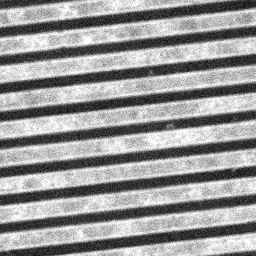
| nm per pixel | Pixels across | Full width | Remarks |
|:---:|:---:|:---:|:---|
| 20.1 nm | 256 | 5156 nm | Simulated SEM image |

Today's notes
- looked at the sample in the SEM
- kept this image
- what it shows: parallel lines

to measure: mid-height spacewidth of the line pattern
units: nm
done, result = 250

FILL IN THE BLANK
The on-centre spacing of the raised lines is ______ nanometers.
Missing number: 560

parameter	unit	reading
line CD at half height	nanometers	305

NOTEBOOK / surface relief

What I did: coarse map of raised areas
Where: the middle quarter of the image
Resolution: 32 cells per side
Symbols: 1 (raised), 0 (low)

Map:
11111111111111111100000000000000
11111111100000000000000000000000
10000000000000000000000000000001
00000000000000000000001111111111
00000000000000111111111111111111
00011111111111111111111111111111
11111111111111111111111111110000
11111111111111111110000000000000
11111111111000000000000000000000
11000000000000000000000000000011
00000000000000000000001111111111
00000000000001111111111111111111
00001111111111111111111111111111
11111111111111111111111111100000
11111111111111111110000000000000
11111111110000000000000000000000
10000000000000000000000000000011
00000000000000000000011111111111
00000000000011111111111111111111
00001111111111111111111111111111
11111111111111111111111111100000
11111111111111111100000000000000
11111111100000000000000000000000
10000000000000000000000000000001
00000000000000000000001111111111
00000000000000111111111111111111
00000111111111111111111111111111
11111111111111111111111111110000
11111111111111111000000000000000
11111111100000000000000000000000
11000000000000000000000000000011
00000000000000000000001111111111